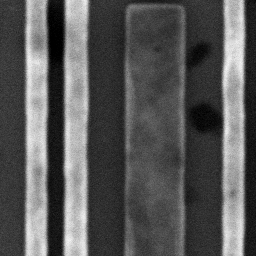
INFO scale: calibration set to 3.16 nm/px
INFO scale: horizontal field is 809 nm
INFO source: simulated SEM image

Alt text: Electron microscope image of wiring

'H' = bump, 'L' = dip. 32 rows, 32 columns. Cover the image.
LLLHHHLLHHHLLLLLLLLLLLLLLLLLHHLL
LLLHHHLLHHHLLLLLHHHHHHHLLLLLHHLL
LLLHHHLLHHHLLLLLHHHHHHHLLLLLHHLL
LLLHHHLLHHHLLLLLHHHHHHHLLLLLHHHL
LLLHHHLLHHHLLLLLHHHHHHHLLLLLHHHL
LLLHHHLLHHHLLLLLHHHHHHHLLLLLHHHL
LLLHHHLLHHHLLLLLHHHHHHHLLLLLHHLL
LLLHHHLLHHHLLLLLHHHHHHHLLLLLHHLL
LLLHHHLLHHHLLLLLHHHHHHHLLLLLHHLL
LLLHHHLLHHHLLLLLHHHHHHHLLLLLHHLL
LLLHHHLLHHHLLLLLHHHHHHHLLLLLHHLL
LLLHHHLLHHHLLLLLHHHHHHHLLLLLHHLL
LLLHHHLLHHHLLLLLHHHHHHHLLLLLHHLL
LLLHHHLLHHHLLLLLHHHHHHHLLLLLHHLL
LLLHHHLLHHHLLLLLHHHHHHHLLLLLHHLL
LLLHHHLLHHHLLLLLHHHHHHHLLLLLHHLL
LLLHHHLLHHHLLLLLHHHHHHHLLLLLHHLL
LLLHHHLLHHHLLLLLHHHHHHHLLLLLHHLL
LLLHHHLLHHHLLLLLHHHHHHHLLLLLHHLL
LLLHHHLLHHHLLLLLHHHHHHHLLLLLHHLL
LLLHHHLLHHHLLLLLHHHHHHHLLLLLHHLL
LLLHHHLLHHHLLLLLHHHHHHHLLLLLHHLL
LLLHHHLLHHHLLLLLHHHHHHHLLLLLHHLL
LLLHHHLLHHHLLLLLHHHHHHHLLLLLHHLL
LLLHHHLLHHHLLLLLHHHHHHHLLLLLHHLL
LLLHHHLLHHHLLLLLHHHHHHHLLLLLHHLL
LLLHHHLLHHHLLLLLHHHHHHHLLLLLHHLL
LLLHHHLLHHHLLLLLHHHHHHHLLLLLHHLL
LLLHHHLLHHHLLLLLHHHHHHHLLLLLHHLL
LLLHHHLLHHHLLLLLHHHHHHHLLLLLHHLL
LLLHHHLLHHHLLLLLHHHHHHHLLLLLHHLL
LLLHHHLLHHHLLLLLHHHHHHHLLLLLHHLL